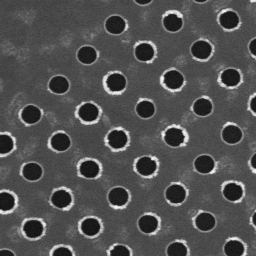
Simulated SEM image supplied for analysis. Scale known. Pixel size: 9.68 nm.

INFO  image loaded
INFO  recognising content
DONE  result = a regular array of holes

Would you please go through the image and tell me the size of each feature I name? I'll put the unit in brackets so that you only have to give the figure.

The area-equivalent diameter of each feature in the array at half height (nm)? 188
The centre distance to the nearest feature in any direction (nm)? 386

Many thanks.